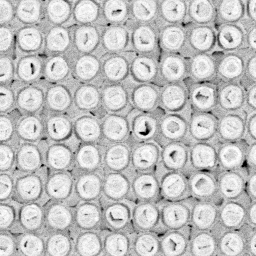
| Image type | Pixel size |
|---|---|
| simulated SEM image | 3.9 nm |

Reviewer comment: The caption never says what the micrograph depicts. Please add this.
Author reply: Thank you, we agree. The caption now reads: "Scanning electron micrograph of a regular array of raised bodies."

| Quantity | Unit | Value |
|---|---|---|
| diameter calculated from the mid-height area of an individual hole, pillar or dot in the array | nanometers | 83.4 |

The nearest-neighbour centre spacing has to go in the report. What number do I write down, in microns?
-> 0.11